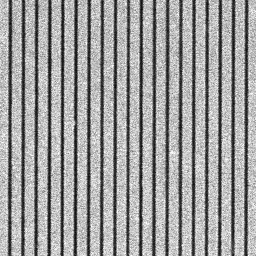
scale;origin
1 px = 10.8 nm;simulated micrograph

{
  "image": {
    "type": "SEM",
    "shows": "parallel lines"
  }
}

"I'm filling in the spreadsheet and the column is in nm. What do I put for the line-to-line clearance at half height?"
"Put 40.7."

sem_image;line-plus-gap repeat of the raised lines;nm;142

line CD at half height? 0.102 µm